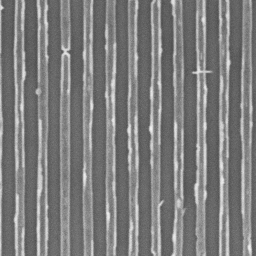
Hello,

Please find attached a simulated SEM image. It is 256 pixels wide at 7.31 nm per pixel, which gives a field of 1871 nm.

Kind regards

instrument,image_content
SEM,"parallel lines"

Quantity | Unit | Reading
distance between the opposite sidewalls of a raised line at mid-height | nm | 66.7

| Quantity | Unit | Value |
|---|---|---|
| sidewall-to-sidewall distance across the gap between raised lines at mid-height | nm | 100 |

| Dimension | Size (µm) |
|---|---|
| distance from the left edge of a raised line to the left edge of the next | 0.166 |